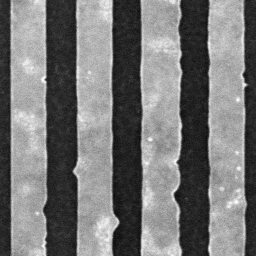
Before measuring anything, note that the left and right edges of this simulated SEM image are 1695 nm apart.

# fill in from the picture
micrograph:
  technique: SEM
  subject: one or a few lines or trenches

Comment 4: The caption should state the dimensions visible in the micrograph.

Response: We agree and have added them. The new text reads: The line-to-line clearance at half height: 200 nm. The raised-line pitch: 438 nm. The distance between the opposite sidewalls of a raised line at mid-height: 0.23 um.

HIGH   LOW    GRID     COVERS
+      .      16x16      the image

.++..++..++..++.
.++..++..++..++.
.++..++..++..++.
.++..++..++..++.
.++..++..++..++.
.++..++..++..++.
.++..++..++..++.
.++..++..++..++.
.++..++..++..++.
.++..++..++..++.
.++..++..++..++.
.++..++..++..++.
.++..++..++..++.
.++..++..++..++.
.++..++..++..++.
.++..++..++..++.